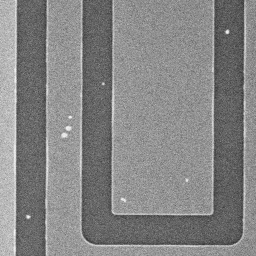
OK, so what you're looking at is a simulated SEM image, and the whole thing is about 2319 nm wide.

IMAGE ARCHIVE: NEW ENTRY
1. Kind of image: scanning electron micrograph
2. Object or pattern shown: groups of lines, slits or small figures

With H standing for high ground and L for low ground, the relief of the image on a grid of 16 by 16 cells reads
HLLHHLLHHHHHHLLH
HLLHHLLHHHHHHLLH
HLLHHLLHHHHHHLLH
HLLHHLLHHHHHHLLH
HLLHHLLHHHHHHLLH
HLLHHLLHHHHHHLLH
HLLHHLLHHHHHHLLH
HLLHHLLHHHHHHLLH
HLLHHLLHHHHHHLLH
HLLHHLLHHHHHHLLH
HLLHHLLHHHHHHLLH
HLLHHLLHHHHHHLLH
HLLHHLLHHHHHHLLH
HLLHHLLLLLLLLLLH
HLLHHLLLLLLLLLLH
HLLHHHHHHHHHHHHH